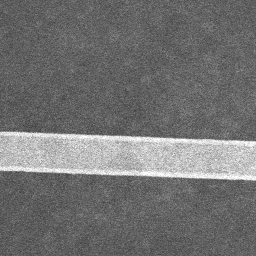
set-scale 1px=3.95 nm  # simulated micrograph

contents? one or a few lines or trenches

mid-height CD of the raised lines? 0.14 microns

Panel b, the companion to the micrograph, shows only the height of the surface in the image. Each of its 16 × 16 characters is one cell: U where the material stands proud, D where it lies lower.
DDDDDDDDDDDDDDDD
DDDDDDDDDDDDDDDD
DDDDDDDDDDDDDDDD
DDDDDDDDDDDDDDDD
DDDDDDDDDDDDDDDD
DDDDDDDDDDDDDDDD
DDDDDDDDDDDDDDDD
DDDDDDDDDDDDDDDD
UUUUDDDDDDDDDDDD
UUUUUUUUUUUUUUUU
UUUUUUUUUUUUUUUU
DDDDDDDDDDDDDDDD
DDDDDDDDDDDDDDDD
DDDDDDDDDDDDDDDD
DDDDDDDDDDDDDDDD
DDDDDDDDDDDDDDDD